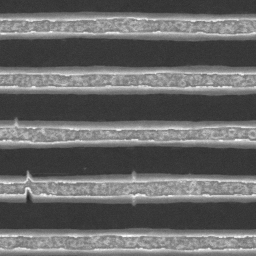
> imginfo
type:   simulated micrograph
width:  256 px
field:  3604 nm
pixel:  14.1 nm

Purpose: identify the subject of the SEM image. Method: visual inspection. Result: parallel lines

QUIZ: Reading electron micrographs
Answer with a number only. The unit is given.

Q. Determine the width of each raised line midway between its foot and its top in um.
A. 0.289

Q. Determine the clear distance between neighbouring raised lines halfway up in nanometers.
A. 468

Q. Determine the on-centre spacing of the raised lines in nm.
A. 762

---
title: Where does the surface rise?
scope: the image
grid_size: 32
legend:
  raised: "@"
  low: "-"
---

--------------------------------
--------------------------------
@@@@@@@@@@@@@@@@@@@@@@@@@@@@@@@@
@@@@@@@@@@@@@@@@@@@@@@@@@@@@@@@@
--@@@@--------------@@@@@@@@@@@@
--------------------------------
--------------------------------
--------------------------------
--------------------------------
@@@@@@@@@@@@@@@@@@@@@@@@@@@@@@@@
@@@@@@@@@@@@@@@@@@@@@@@@@@@@@@@@
--------------------------------
--------------------------------
--------------------------------
--------------------------------
--------------------------------
@@@@@@@@@@@@@@@@@@@@@@@@@@@@@@@@
@@@@@@@@@@@@@@@@@@@@@@@@@@@@@@@@
--------------------------------
--------------------------------
--------------------------------
--------------------------------
@@@@@@@@@@@@@@@@@@@@@@@@@@@@@@@@
@@@@@@@@@@@@@@@@@@@@@@@@@@@@@@@@
@@@@@@@@@@@@@@@@@@@@@@@@@@@@@@@@
--------------------------------
--------------------------------
--------------------------------
--------------------------------
@@@@@@@@@@@@@@@@@@@@@@@@@@@@@@@@
@@@@@@@@@@@@@@@@@@@@@@@@@@@@@@@@
@@@@@@@@-@@@@@@@@@@@@@@@@@@@@@@@